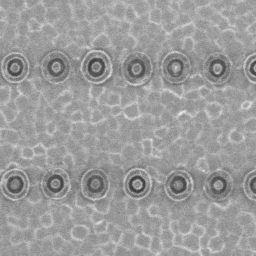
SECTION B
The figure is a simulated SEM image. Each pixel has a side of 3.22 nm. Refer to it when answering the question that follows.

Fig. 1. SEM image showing a regular array of ring-shaped raised bodies with a dot in the middle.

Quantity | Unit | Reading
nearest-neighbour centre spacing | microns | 0.128